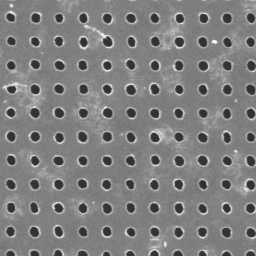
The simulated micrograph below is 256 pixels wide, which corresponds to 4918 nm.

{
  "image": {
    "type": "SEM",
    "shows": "a regular array of holes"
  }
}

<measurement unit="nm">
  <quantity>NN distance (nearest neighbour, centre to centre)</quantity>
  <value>448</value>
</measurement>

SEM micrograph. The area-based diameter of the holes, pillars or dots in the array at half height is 9.23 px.